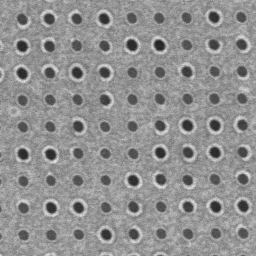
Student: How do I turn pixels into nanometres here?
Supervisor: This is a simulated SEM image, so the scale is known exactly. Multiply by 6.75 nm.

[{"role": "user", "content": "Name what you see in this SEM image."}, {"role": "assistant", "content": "a regular array of holes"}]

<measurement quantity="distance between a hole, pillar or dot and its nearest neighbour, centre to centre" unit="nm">181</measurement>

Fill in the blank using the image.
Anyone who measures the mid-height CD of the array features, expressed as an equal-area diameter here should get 80.6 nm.